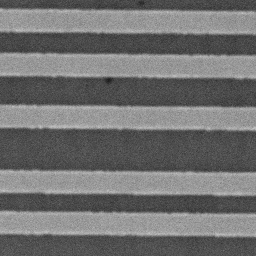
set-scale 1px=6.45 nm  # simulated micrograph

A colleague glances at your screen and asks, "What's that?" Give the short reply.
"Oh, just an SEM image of lines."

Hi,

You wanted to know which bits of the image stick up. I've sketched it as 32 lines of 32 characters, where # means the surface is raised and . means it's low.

................................
#######################.........
################################
################################
................................
................................
................................
################################
################################
......#..#######################
................................
................................
................................
############################....
################################
################################
................................
................................
................................
................................
................................
#############.#.................
################################
################################
................................
................................
##..............................
################################
################################
................................
................................
................................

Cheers